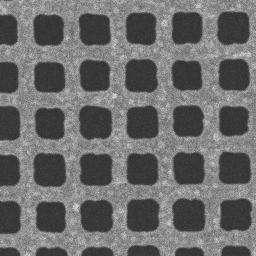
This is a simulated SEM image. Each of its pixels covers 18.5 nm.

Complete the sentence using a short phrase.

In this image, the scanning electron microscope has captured a regular array of holes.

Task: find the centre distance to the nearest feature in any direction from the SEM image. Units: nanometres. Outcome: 850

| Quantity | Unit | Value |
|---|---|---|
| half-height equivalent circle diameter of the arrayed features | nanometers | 643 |